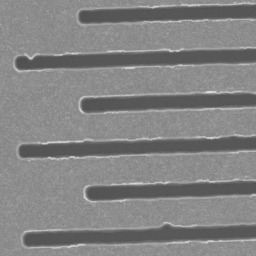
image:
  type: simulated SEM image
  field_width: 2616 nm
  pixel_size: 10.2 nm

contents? parallel lines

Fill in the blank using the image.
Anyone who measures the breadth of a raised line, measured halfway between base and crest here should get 322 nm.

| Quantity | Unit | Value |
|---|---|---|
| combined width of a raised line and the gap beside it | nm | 451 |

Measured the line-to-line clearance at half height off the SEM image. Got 0.129 microns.